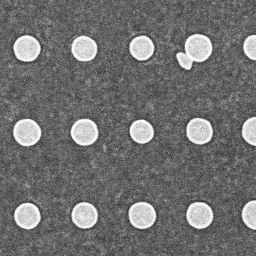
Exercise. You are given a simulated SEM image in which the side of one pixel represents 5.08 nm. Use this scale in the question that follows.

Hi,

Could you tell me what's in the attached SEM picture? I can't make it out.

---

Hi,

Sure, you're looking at a regular array of raised bodies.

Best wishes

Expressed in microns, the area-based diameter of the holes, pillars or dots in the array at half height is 0.127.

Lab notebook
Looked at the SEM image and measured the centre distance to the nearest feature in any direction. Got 57.3 pixels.